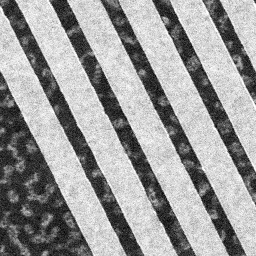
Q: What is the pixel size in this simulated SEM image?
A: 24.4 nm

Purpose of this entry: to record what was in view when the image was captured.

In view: parallel lines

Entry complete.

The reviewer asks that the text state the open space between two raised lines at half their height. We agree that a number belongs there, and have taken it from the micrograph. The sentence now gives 403 nm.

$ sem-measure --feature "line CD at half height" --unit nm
703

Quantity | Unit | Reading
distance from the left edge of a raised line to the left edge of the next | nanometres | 1110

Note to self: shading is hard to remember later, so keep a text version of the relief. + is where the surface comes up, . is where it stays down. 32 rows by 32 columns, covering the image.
..++++...++++..++++..++++...++++
...++++..++++...++++..++++..++++
+..++++...++++..++++...+++...+++
+...++++..++++...++++..++++..+++
++..++++...++++..++++...+++...++
++...++++..++++...++++..++++..++
+++..++++...++++..++++...+++...+
+++...++++..++++...++++..++++..+
++++..++++...++++..++++...+++...
++++...++++..++++...++++..++++..
.++++..++++...++++..++++...+++..
.++++...++++..++++...++++..++++.
..++++..++++...++++..++++...++++
..++++...++++..++++...++++..++++
...++++..++++...++++..++++...+++
...++++...++++..++++...++++..+++
....++++..++++...++++..++++..+++
.....+++...++++..++++...++++..++
.....++++..++++...++++..++++..++
......+++...++++..++++...++++..+
......++++..++++...++++..++++..+
.......+++...++++..++++...++++..
.......++++..++++...++++..++++..
.......++++...++++..++++...++++.
........++++..+++++..++++..++++.
........+++++..++++..++++...++++
.........++++..++++...++++..++++
..........++++..++++..++++...+++
..........++++..++++...++++..+++
...........++++..++++..++++...++
...........++++..++++...++++..++
............++++..++++..++++...+